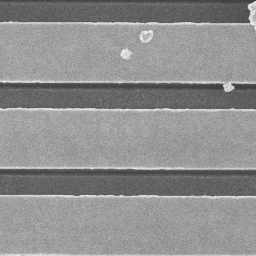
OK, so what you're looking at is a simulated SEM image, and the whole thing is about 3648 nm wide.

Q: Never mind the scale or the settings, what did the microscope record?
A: lines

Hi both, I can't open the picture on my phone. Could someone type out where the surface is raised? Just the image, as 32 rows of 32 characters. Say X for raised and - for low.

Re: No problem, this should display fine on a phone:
-------------------------------X
-------------------------------X
-------------------------------X
XXXXXXXXXXXXXXXXXXXXXXXXXXXXXXXX
XXXXXXXXXXXXXXXXXXXXXXXXXXXXXXXX
XXXXXXXXXXXXXXXXXXXXXXXXXXXXXXXX
XXXXXXXXXXXXXXXXXXXXXXXXXXXXXXXX
XXXXXXXXXXXXXXXXXXXXXXXXXXXXXXXX
XXXXXXXXXXXXXXXXXXXXXXXXXXXXXXXX
XXXXXXXXXXXXXXXXXXXXXXXXXXXXXXXX
---------------------------XXX--
--------------------------------
--------------------------------
--X-----------------------------
XXXXXXXXXXXXXXXXXXXXXXXXXXXXXXXX
XXXXXXXXXXXXXXXXXXXXXXXXXXXXXXXX
XXXXXXXXXXXXXXXXXXXXXXXXXXXXXXXX
XXXXXXXXXXXXXXXXXXXXXXXXXXXXXXXX
XXXXXXXXXXXXXXXXXXXXXXXXXXXXXXXX
XXXXXXXXXXXXXXXXXXXXXXXXXXXXXXXX
XXXXXXXXXXXXXXXXXXXXXXXXXXXXXXXX
--------------------------------
--------------------------------
--------------------------------
XXXXXXXXXXXXXXXXXXXX---XXX------
XXXXXXXXXXXXXXXXXXXXXXXXXXXXXXXX
XXXXXXXXXXXXXXXXXXXXXXXXXXXXXXXX
XXXXXXXXXXXXXXXXXXXXXXXXXXXXXXXX
XXXXXXXXXXXXXXXXXXXXXXXXXXXXXXXX
XXXXXXXXXXXXXXXXXXXXXXXXXXXXXXXX
XXXXXXXXXXXXXXXXXXXXXXXXXXXXXXXX
XXXXXXXXXXXXXXXXXXXXXXXXXXXXXXXX